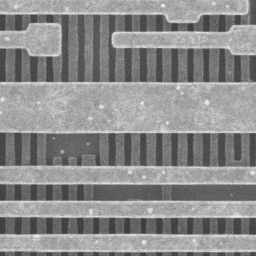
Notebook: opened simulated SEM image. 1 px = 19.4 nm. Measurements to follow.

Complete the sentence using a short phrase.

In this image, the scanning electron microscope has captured wiring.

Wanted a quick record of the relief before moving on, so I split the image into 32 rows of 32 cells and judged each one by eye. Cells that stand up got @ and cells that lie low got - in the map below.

@@@@@@@@@@@@@@@@@@@@@@@@@@@@@@@-
@@@@@@@@@@@@@@@@@@@@@@@@@@@@@@@-
---------------------@@@@-------
---@@@@@---------------------@@@
@@@@@@@@------@@@@@@@@@@@@@@@@@@
@@@@@@@@------@@@@@@@@@@@@@@@@@@
----@@@@---------------------@@@
--------------------------------
--------------------------------
--------------------------------
@@@@@@@@@@@@@@@@@@@@@@@@@@@@@@@@
@@@@@@@@@@@@@@@@@@@@@@@@@@@@@@@@
@@@@@@@@@@@@@@@@@@@@@@@@@@@@@@@@
@@@@@@@@@@@@@@@@@@@@@@@@@@@@@@@@
@@@@@@@@@@@@@@@@@@@@@@@@@@@@@@@@
@@@@@@@@@@@@@@@@@@@@@@@@@@@@@@@@
@@@@@@@@@@@@@@@@@@@@@@@@@@@@@@@@
--------------------------------
--------------------------------
--------------------------------
--------------------------------
@@@@@@@@@@@@@@@@@@@@@@@@@@@@@@@@
@@@@@@@@@@@@@@@@@@@@@@@@@@@@@@@@
--------------------------------
--------------------------------
@@@@@@@@@@@@@@@@@@@@@@@@@@@@@@@@
@@@@@@@@@@@@@@@@@@@@@@@@@@@@@@@@
--------------------------------
--------------------------------
@@@@@@@@@@@@@@@@@@@@@@@@@@@@@@@@
@@@@@@@@@@@@@@@@@@@@@@@@@@@@@@@@
--------------------------------